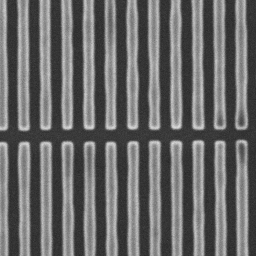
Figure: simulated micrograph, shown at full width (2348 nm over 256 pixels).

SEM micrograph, groups of lines, slits or small figures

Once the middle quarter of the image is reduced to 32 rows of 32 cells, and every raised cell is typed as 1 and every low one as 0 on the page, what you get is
11000110001110001100001000011000
11000110001110001100001000011000
11000110001110001100001000011000
11000110001110001100001100011000
11000110001110001100001100011000
11000110001110001100011100011000
11000110000110001100011100011000
11000110000110001100011100011000
11000110000110001100011100011000
11000110000110001100011100011000
11000110000110001100001100011000
11000110000110001100001100011000
11000110000110001100001100011000
11000111000110001100001100011000
11000111000110001100011100011000
11000110000110001100011100011000
00000000000000000000000000000000
00000000000000000000000000000000
00000000000000000000000000000000
00000000000000000000001100011000
11000111000110001100011100011000
11000111000110001100001100011000
11000111000110001100001100011000
11000111000110001100001100011000
11000110000110001100011100011000
11000110000110001100011100011000
11000111000110001100001100011000
11000111000110001100001100011000
11000111000110001100001100011000
11000111000110001100001100011000
11000111000110001100001100011000
11000111000110001100001100011000